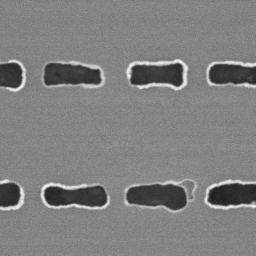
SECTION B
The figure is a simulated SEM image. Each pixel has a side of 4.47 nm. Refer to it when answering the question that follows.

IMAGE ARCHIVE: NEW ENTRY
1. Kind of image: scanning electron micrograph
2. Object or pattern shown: holes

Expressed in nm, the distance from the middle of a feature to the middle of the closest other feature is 384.